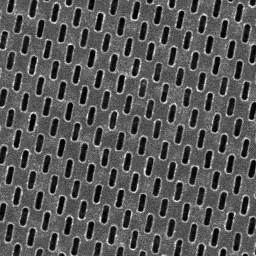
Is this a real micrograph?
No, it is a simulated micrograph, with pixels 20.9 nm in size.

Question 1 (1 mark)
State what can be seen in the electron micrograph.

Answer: a regular array of holes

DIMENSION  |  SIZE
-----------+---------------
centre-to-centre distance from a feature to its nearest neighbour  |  450 nm